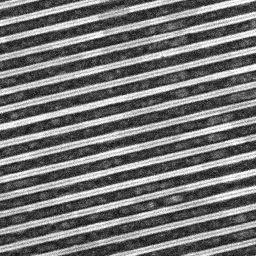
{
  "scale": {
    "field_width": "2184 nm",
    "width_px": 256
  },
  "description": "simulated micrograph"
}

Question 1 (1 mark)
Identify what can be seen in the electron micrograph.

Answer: parallel lines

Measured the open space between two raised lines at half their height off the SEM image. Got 0.112 microns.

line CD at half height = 32.2 nm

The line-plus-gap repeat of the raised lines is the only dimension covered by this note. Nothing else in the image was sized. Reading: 144 nm